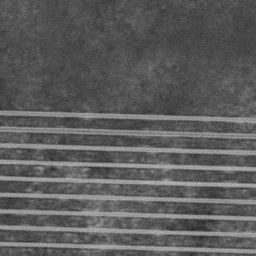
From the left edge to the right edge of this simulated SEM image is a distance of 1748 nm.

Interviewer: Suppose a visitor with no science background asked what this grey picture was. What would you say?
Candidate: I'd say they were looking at parallel lines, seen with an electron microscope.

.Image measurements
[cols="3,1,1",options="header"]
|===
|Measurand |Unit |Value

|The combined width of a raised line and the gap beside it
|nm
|112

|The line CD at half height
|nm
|24.7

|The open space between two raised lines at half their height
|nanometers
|87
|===